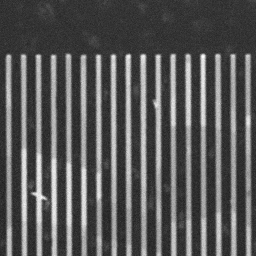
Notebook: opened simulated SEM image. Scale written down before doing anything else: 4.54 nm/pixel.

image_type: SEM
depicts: parallel lines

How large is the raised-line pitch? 68 nm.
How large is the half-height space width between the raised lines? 0.0528 microns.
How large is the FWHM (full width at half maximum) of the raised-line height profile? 0.0176 um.